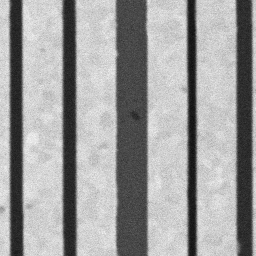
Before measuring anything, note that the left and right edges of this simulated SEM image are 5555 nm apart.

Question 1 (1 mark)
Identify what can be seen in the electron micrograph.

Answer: lines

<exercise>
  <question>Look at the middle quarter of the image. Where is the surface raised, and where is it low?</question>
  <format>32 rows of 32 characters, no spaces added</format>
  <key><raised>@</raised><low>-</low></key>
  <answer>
---@@@@@@@@@@--------@@@@@@@@@@-
---@@@@@@@@@@--------@@@@@@@@@@-
---@@@@@@@@@@--------@@@@@@@@@@-
---@@@@@@@@@@--------@@@@@@@@@@-
---@@@@@@@@@@--------@@@@@@@@@@-
---@@@@@@@@@@--------@@@@@@@@@@-
---@@@@@@@@@@--------@@@@@@@@@@-
---@@@@@@@@@@--------@@@@@@@@@@-
---@@@@@@@@@@--------@@@@@@@@@@-
---@@@@@@@@@@--------@@@@@@@@@@-
---@@@@@@@@@@--------@@@@@@@@@@-
---@@@@@@@@@@--------@@@@@@@@@@-
---@@@@@@@@@@--------@@@@@@@@@@-
---@@@@@@@@@@--------@@@@@@@@@@-
---@@@@@@@@@@--------@@@@@@@@@@-
---@@@@@@@@@@--------@@@@@@@@@@-
---@@@@@@@@@@--------@@@@@@@@@@-
---@@@@@@@@@@--------@@@@@@@@@@-
---@@@@@@@@@@--------@@@@@@@@@@-
---@@@@@@@@@@--------@@@@@@@@@@-
---@@@@@@@@@@--------@@@@@@@@@@-
---@@@@@@@@@@--------@@@@@@@@@@-
---@@@@@@@@@@--------@@@@@@@@@@-
---@@@@@@@@@@--------@@@@@@@@@@-
---@@@@@@@@@@--------@@@@@@@@@@-
---@@@@@@@@@@--------@@@@@@@@@@-
---@@@@@@@@@@--------@@@@@@@@@@-
---@@@@@@@@@@--------@@@@@@@@@@-
---@@@@@@@@@@--------@@@@@@@@@@-
---@@@@@@@@@@--------@@@@@@@@@@-
---@@@@@@@@@@--------@@@@@@@@@@-
---@@@@@@@@@@--------@@@@@@@@@@-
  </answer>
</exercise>